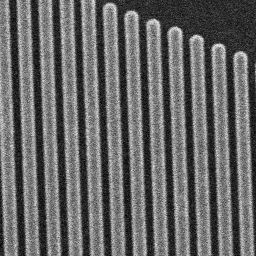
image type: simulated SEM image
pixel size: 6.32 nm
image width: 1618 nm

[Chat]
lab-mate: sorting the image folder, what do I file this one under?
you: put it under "parallel lines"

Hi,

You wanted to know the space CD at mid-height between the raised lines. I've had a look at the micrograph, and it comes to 0.0553 um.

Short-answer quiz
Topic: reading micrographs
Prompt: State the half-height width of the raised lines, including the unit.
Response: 0.0766 um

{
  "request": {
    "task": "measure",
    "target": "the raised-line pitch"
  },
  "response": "0.136 micrometres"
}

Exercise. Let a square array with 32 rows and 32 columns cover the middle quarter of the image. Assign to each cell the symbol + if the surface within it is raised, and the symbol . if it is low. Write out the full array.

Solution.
+++..+++...++...+++..+++...++...
+++..+++..+++...+++..+++...++...
+++..+++..+++...+++..+++...++...
+++..+++..+++...+++..+++...+++..
+++..+++...+++..+++..+++...+++..
+++..+++...+++..+++..+++...+++..
+++..+++...+++..+++..+++...+++..
+++..+++...+++..+++..+++...+++..
+++..+++...+++..+++..+++...+++..
+++..+++...+++..+++...++...+++..
+++...++...+++..+++...+++..+++..
+++...++...+++..+++...+++..+++..
+++...++...+++..+++...+++..+++..
+++...++...+++..+++...+++..+++..
+++...++...+++..+++...+++..+++..
+++...+++..+++..+++...+++..+++..
+++...+++..+++..+++...+++..+++..
+++...+++..+++..+++...+++..+++..
+++...+++..+++..+++...+++..+++..
+++...+++..+++..+++...+++..+++..
+++...+++..+++..++++..+++..+++..
.++...+++..+++...+++..+++..+++..
.++...+++..+++...+++..+++..+++..
.++...+++..+++...+++..+++..+++..
.++...+++..+++...+++..+++..+++..
.++...+++..+++...+++..+++..+++..
.+++..+++...++...+++..+++...++..
.+++..+++...++...+++..+++...++..
.+++..+++...++...+++..+++...+++.
.+++..+++...++...+++..+++...+++.
.+++..+++...++...+++..+++...+++.
.+++..+++...+++..+++..+++...+++.